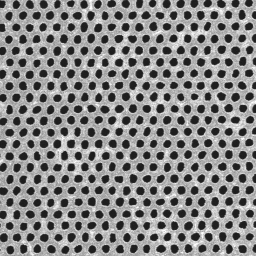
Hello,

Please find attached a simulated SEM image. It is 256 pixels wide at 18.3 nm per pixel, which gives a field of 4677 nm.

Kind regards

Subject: a regular array of holes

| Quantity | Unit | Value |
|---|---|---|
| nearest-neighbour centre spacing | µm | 0.239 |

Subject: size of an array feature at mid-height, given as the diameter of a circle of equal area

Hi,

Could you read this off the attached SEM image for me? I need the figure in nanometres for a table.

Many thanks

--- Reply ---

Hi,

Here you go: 150